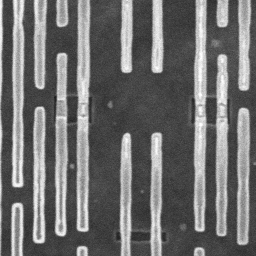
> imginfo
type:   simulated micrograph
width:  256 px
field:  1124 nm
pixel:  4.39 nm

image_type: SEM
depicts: wiring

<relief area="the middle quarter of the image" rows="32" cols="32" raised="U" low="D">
UDDDUUDDDDDDDDDUUDDDDDUUDDDDDDDD
UDDDUUDDDDDDDDDUUDDDDDUUDDDDDDDD
UDDDUUDDDDDDDDDDDDDDDDDDDDDDDDDD
UDDDUUDDDDDDDDDDDDDDDDDDDDDDDDDD
DDDDUUDDDDDDDDDDDDDDDDDDDDDDDDDD
DDDDUUDDDDDDDDDDDDDDDDDDDDDDDDDD
DDDDUUDDDDDDDDDDDDDDDDDDDDDDDDDD
DDDDUUDDDDDDDDDDDDDDDDDDDDDDDDDD
DDDDUUDDDDDDDDDDDDDDDDDDDDDDDDDD
DDDDUDDDDDDDDDDDDDDDDDDDDDDDDDDD
DDDDDDDDDDDDDDDDDDDDDDDDDDDDDDDD
DDDDDDDDDDDDDDDDDDDDDDDDDDDDDDDD
DDDDDDDDDDDDDDDDDDDDDDDDDDDDDDDD
DDDDUDDDDDDDDDDDDDDDDDDDDDDDDDDD
UDDDUUDDDDDDDDDDDDDDDDDDDDDDDDDD
UDDDUUDDDDDDDDDDDDDDDDDDDDDDDDDD
UDDDUUDDDDDDDDDDDDDDDDDDDDDDDDDD
UDDDUUDDDDDDDDDUDDDDDDUUDDDDDDDD
UDDDUUDDDDDDDDDUDDDDDDUUDDDDDDDD
UDDDUUDDDDDDDDDUUDDDDDUUDDDDDDDD
UDDDUUDDDDDDDDDUUDDDDDUUDDDDDDDD
UDDDUUDDDDDDDDDUUDDDDDUUDDDDDDDD
UDDDUUDDDDDDDDDUUDDDDDUUDDDDDDDD
UDDDUUDDDDDDDDDUUDDDDDUUDDDDDDDD
UDDDUUDDDDDDDDDUUDDDDDUUDDDDDDDD
UDDDUUDDDDDDDDUUUDDDDDUUDDDDDDDD
DDDDUUDDDDDDDDUUUDDDDDUUDDDDDDDD
DDDDUUDDDDDDDDUUUDDDDDUUDDDDDDDD
DDDDUUDDDDDDDDUUUDDDDDUUDDDDDDDD
DDDDUUDDDDDDDDUUUDDDDDUUDDDDDDDD
DDDDUUDDDDDDDDUUUDDDDDUUDDDDDDDD
DDDDUUDDDDDDDDUUUDDDDDUUDDDDDDDD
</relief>